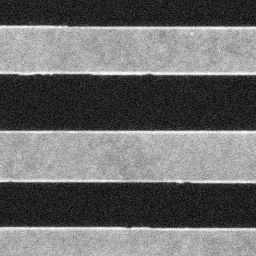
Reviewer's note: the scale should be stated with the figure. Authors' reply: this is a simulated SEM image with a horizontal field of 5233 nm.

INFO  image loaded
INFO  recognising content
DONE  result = lines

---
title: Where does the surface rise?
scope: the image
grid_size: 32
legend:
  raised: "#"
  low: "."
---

................................
................................
................................
################################
################################
################################
################################
################################
################################
................................
................................
................................
................................
................................
................................
................................
################################
################################
################################
################################
################################
################################
################################
................................
................................
................................
................................
................................
###############.................
################################
################################
################################